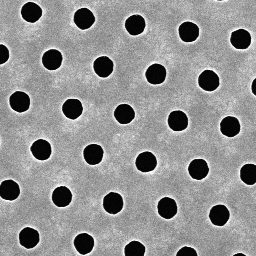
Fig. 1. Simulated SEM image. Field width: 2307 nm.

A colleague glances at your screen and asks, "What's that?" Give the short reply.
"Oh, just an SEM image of a regular array of holes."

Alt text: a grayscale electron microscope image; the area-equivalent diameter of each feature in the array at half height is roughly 188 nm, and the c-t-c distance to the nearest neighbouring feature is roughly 458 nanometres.